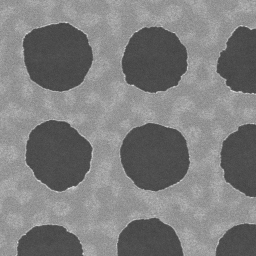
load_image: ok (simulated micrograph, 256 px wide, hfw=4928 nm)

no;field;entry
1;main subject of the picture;holes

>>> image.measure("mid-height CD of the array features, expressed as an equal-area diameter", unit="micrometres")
1.32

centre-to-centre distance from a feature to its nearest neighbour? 1860 nm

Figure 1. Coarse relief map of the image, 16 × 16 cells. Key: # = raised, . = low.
################
###.############
#.....##...###..
#.....##....##..
##....##....##..
###..####..###..
################
################
##...###...###..
##....##....##..
##....##....##..
###..###...###..
################
################
##..####...###..
#....##....###..